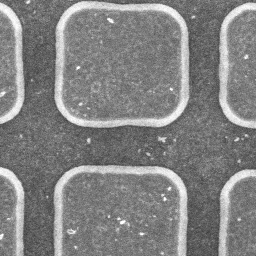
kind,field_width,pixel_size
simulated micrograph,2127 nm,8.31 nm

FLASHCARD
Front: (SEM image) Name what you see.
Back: raised bodies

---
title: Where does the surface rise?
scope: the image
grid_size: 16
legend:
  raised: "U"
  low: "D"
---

DDDDDUUUUUDDDDDU
UDDDUUUUUUUDDDUU
UDDDUUUUUUUUDDUU
UDDDUUUUUUUUDDUU
UDDDUUUUUUUUDDUU
UDDDUUUUUUUUDDUU
UDDDUUUUUUUDDDUU
DDDDDUUUUUUDDDDU
DDDDDDDDDDDDDDDD
DDDDDDDDDDDDDDDD
DDDDDDDDDDDDDDDD
UDDDUUUUUUUDDDUU
UDDDUUUUUUUDDDUU
UDDDUUUUUUUUDDUU
UDDDUUUUUUUDDDUU
UDDDUUUUUUUDDDUU